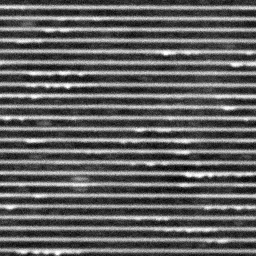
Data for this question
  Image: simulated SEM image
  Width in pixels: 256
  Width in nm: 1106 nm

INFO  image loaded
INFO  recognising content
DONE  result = parallel lines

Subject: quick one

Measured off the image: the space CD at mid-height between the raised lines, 8.5 px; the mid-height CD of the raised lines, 0.0113 microns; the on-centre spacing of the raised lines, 0.0478 micrometres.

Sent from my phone